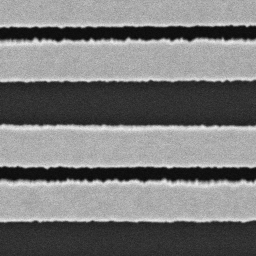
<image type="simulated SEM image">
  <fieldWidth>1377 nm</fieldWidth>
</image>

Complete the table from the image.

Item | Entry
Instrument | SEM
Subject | lines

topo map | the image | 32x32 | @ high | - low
@@@@@@@@@@@@@@@@@@@@@@@@@@@@@@@@
@@@@@@@@@@@@@@@@@@@@@@@@@@@@@@@@
@@@@@@@@@@@@@@@@@@@@@@@@@@@@@@@@
--------------------------------
--------------------------------
@@@@@@@@@@@@@@@@@@@@@@@@@@@@@@@@
@@@@@@@@@@@@@@@@@@@@@@@@@@@@@@@@
@@@@@@@@@@@@@@@@@@@@@@@@@@@@@@@@
@@@@@@@@@@@@@@@@@@@@@@@@@@@@@@@@
@@@@@@@@@@@@@@@@@@@@@@@@@@@@@@@@
--------------------------------
--------------------------------
--------------------------------
--------------------------------
--------------------------------
--------------------------------
@@@@@@@@@@@@@@@@@@@@@@@@@@@@@@@@
@@@@@@@@@@@@@@@@@@@@@@@@@@@@@@@@
@@@@@@@@@@@@@@@@@@@@@@@@@@@@@@@@
@@@@@@@@@@@@@@@@@@@@@@@@@@@@@@@@
@@@@@@@@@@@@@@@@@@@@@@@@@@@@@@@@
--------------------------------
@-@-----@@---@@-@---@---------@-
@@@@@@@@@@@@@@@@@@@@@@@@@@@@@@@@
@@@@@@@@@@@@@@@@@@@@@@@@@@@@@@@@
@@@@@@@@@@@@@@@@@@@@@@@@@@@@@@@@
@@@@@@@@@@@@@@@@@@@@@@@@@@@@@@@@
@@@@@@@@@@@@@@@@@@@@@@@@@@@@@@@@
--------------------------------
--------------------------------
--------------------------------
--------------------------------